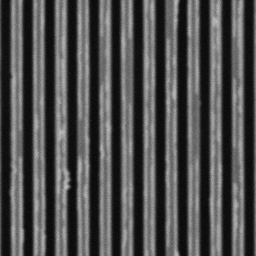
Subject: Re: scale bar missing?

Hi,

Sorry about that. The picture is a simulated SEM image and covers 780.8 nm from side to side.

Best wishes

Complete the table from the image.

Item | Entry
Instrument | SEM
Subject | parallel lines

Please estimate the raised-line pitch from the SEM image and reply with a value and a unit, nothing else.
67.3 nm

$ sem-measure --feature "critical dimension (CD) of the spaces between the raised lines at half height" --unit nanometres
34.3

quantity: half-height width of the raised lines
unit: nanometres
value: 34.3